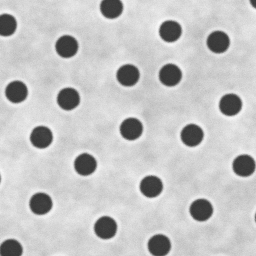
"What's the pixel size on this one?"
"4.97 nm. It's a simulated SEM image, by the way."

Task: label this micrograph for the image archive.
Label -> a regular array of holes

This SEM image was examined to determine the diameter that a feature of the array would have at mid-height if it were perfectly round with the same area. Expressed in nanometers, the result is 116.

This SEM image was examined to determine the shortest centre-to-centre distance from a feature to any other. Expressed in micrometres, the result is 0.251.